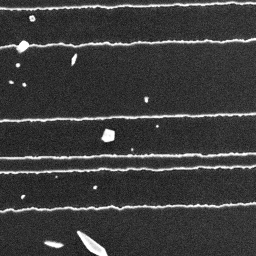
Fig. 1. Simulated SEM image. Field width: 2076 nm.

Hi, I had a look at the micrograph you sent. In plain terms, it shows lines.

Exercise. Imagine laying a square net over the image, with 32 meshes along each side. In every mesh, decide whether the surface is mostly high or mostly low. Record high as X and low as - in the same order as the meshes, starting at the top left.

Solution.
XXXXXXXXXXXXXXXXXXXXXXXXXXX-----
--------------------------------
--------------------------------
--------------------------------
--------------------------------
---X---X---XXXXXXXXXXXXXXXXXXXXX
XXXXXXXXXXXXXXXXXXXXXXXXXXXXXXXX
XXXXXXXXXXXXXXXXXXXXXXXXXXXXXXXX
XXXXXXXXXXXXXXXXXXXXXXXXXXXXXXXX
XXXXXXXXXXXXXXXXXXXXXXXXXXXXXXXX
XXXXXXXXXXXXXXXXXXXXXXXXXXXXXXXX
XXXXXXXXXXXXXXXXXXXXXXXXXXXXXXXX
XXXXXXXXXXXXXXXXXXXXXXXXXXXXXXXX
XXXXXXXXXXXXXXXXXXXXXXXXXXXXXXXX
XXXXXXXXXXXXXXXXXXXXXXXXXX------
--------------------------------
-------------X------------------
-------------X------------------
--------------------------------
------------XXX-X-XXX-XXXXXXXXXX
XXXXXXXXXXXXXXXXXXXXXXXXXXXXXXXX
XXXXXXX-------------------------
--------------------------------
--------------------------------
--------------------------------
-----------------------------XXX
XXXXXXXXXXXXXXXXXXXXXXXXXXXXXXXX
XXXXXXXXXXXXXXXXXXXXXXXXXXXXXXXX
XXXXXXXXXXXXXXXXXXXXXXXXXXXXXXXX
XXXXXXXXXXXXXXXXXXXXXXXXXXXXXXXX
XXXXXXXXXXXXXXXXXXXXXXXXXXXXXXXX
XXXXXXXXXXXXXXXXXXXXXXXXXXXXXXXX